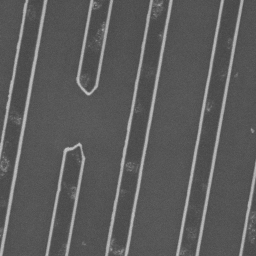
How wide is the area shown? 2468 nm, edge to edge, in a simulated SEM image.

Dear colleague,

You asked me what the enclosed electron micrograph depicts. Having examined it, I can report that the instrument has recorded one or a few lines or trenches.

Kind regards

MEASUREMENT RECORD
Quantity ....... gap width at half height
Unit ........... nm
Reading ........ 426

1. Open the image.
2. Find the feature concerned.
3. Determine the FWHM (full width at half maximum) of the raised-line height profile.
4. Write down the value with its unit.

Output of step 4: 190 nm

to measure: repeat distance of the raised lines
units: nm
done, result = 620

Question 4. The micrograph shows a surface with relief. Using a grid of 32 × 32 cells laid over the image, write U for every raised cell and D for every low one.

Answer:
DDDUUUDDDDDUUUDDDDDUUDDDDDDDUUDD
DDDUUUDDDDDUUUDDDDDUUDDDDDDUUUDD
DDDUUDDDDDDUUUDDDDUUUDDDDDDUUUDD
DDDUUDDDDDDUUDDDDDUUUDDDDDDUUUDD
DDDUUDDDDDDUUDDDDDUUUDDDDDDUUUDD
DDUUUDDDDDUUUDDDDDUUDDDDDDDUUDDD
DDUUUDDDDDUUUDDDDDUUDDDDDDDUUDDD
DDUUDDDDDDUUUDDDDDUUDDDDDDUUUDDD
DDUUDDDDDDUUUDDDDUUUDDDDDDUUUDDD
DDUUDDDDDDUUDDDDDUUUDDDDDDUUUDDD
DUUUDDDDDDUUDDDDDUUUDDDDDDUUDDDD
DUUUDDDDDDDDDDDDDUUDDDDDDDUUDDDD
DUUDDDDDDDDDDDDDDUUDDDDDDDUUDDDD
DUUDDDDDDDDDDDDDDUUDDDDDDUUUDDDD
DUUDDDDDDDDDDDDDUUUDDDDDDUUUDDDD
DUUDDDDDDDDDDDDDUUUDDDDDDUUUDDDD
UUUDDDDDDDDDDDDDUUDDDDDDDUUDDDDD
UUUDDDDDDDDDDDDDUUDDDDDDDUUDDDDD
UUDDDDDDDUDDDDDDUUDDDDDDUUUDDDDD
UUDDDDDDUUDDDDDUUUDDDDDDUUUDDDDD
UUDDDDDDUUDDDDDUUUDDDDDDUUUDDDDD
UUDDDDDDUUDDDDDUUUDDDDDDUUUDDDDD
UUDDDDDUUUDDDDDUUDDDDDDDUUDDDDDD
UUDDDDDUUUDDDDDUUDDDDDDDUUDDDDDD
UDDDDDDUUUDDDDDUUDDDDDDDUUDDDDDU
UDDDDDDUUUDDDDUUUDDDDDDUUUDDDDDU
UDDDDDDUUDDDDDUUUDDDDDDUUUDDDDDU
UDDDDDDUUDDDDDUUUDDDDDDUUDDDDDDU
UDDDDDUUUDDDDDUUDDDDDDDUUDDDDDDU
UDDDDDUUUDDDDDUUDDDDDDDUUDDDDDDU
DDDDDDUUUDDDDDUUDDDDDDUUUDDDDDUU
DDDDDDUUDDDDDUUUDDDDDDUUUDDDDDUU